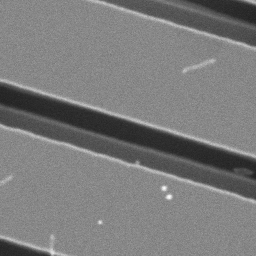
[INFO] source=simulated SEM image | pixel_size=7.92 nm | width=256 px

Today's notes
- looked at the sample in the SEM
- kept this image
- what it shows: lines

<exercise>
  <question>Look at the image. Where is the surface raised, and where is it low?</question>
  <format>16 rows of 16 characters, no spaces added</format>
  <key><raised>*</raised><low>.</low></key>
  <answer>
********........
***********.....
**************..
****************
****************
..**************
.....***********
........********
**.........*****
******.........*
*********.......
*************...
****************
****************
****************
..**************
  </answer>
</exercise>